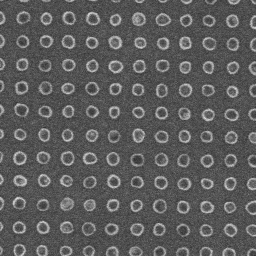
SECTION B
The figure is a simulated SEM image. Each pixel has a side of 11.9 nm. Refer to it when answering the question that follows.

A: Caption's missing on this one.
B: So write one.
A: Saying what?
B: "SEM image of a regular array of raised bodies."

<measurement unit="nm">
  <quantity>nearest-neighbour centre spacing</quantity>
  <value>268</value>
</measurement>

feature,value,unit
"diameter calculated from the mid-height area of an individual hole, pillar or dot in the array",144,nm